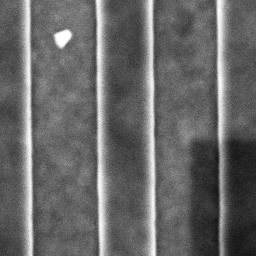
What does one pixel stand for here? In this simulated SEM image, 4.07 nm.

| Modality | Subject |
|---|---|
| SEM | wiring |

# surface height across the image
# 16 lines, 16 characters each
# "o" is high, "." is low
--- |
oo....oooo....oo
oo....oooo....oo
oo....oooo....oo
oo....oooo....oo
oo....oooo....oo
oo....oooo....oo
oo....oooo....oo
oo....oooo....oo
oo....oooo....oo
oo....oooo....oo
oo....oooo....oo
oo....oooo....oo
oo....oooo....oo
oo....oooo....oo
oo....oooo....oo
oo....oooo....oo